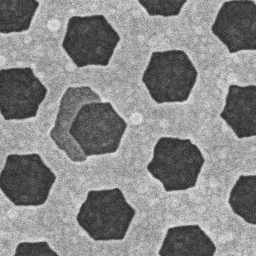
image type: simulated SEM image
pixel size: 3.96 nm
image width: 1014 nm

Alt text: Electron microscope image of holes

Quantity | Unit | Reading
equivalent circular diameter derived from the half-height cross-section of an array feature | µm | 0.214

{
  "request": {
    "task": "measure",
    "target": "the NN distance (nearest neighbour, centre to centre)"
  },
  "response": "346 nanometers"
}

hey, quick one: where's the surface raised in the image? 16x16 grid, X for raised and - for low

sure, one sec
--XXXXXXX--XXX--
--XX---XXXXXX---
XXXX---XXXXXXX--
XXXX---XXX--XXXX
--XXXXXXX---XXXX
---X--XXX---XX--
---X---XXXXXXX--
XXX-----XXXXXX--
XXX-----XXXXXXX-
XXXX---XXX---XXX
---XXXXXX----XXX
---XXXXXXX--XXX-
X--XX---XXXXXX--
XXXXX---XXXXXXX-
XXXXX---XXX--XXX
X--XXXXXXX---XXX